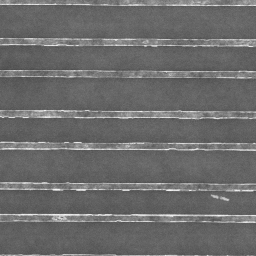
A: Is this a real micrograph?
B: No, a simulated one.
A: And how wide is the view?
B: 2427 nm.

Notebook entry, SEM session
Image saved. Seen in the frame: parallel lines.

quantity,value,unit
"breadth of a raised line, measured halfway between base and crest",64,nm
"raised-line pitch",0.334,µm